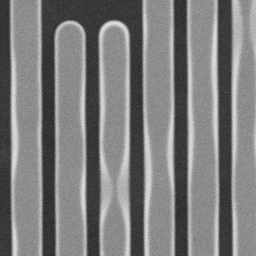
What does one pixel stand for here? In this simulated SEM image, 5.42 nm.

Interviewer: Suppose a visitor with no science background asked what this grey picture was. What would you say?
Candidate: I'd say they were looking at groups of lines, slits or small figures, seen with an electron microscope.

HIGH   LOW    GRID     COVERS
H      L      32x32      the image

LHHHHLLLLLLLLLLLLLHHHHLHHHHLLHHH
LHHHHLLLLLLLLLLLLLHHHHLHHHHLLHHH
LHHHHLLLLLLLLLLLLLHHHHLHHHHLLHHH
LHHHHLLHHHLLLHHHLLHHHHLHHHHLLHHH
LHHHHLLHHHHLLHHHLLHHHHLHHHHLLLHH
LHHHHLLHHHHLLHHHLLHHHHLHHHHLLHHH
LHHHHLLHHHHLLHHHLLHHHHLLHHHLLHHH
LLHHHLLHHHHLLHHHLLHHHHLLHHHLLHHH
LLHHHLLHHHHLLHHHLLHHHHLLHHHLLHHH
LLHHHLLHHHHLLHHHLLHHHHLLHHHLLHHH
LLHHHLLHHHHLLHHHLLHHHHLLHHHLLHHH
LLHHHLLHHHHLLHHHLLHHHHLLHHHLLHHH
LLHHHLLHHHHLLHHHLLHHHHLLHHHLLHHH
LLHHHLLHHHLLLHHHLLHHHHLLHHHLLHHH
LLHHHLLHHHLLLHHHLLHHHHLLHHHLLHHH
LLHHHLLHHHHLLHHHLLHHHHLLHHHLLHHH
LLHHHLLHHHHLLHHHLLHHHLLLHHHLLHHH
LLHHHLLHHHHLLHHHLLHHHLLLHHHLLHHH
LLHHHLLHHHHLLHHHLLHHHLLLHHHLLHHH
LLHHHLLHHHHLLHHHLLHHHLLLHHHLLHHH
LLHHHLLHHHHLLHHHLLHHHLLLHHHLLHHH
LLHHHLLHHHHLLHHHLLHHHLLLHHHLLHHH
LLHHHLLHHHHLLHHHLLHHHHLLHHHLLHHH
LLHHHLLHHHHLLHHHLLHHHHLLHHHLLHHH
LLHHHLLHHHHLLHHHLLHHHHLLHHHLLHHH
LLHHHLLHHHHLLHHHLLHHHHLLHHHLLHHH
LLHHHLLHHHHLLHHHLLHHHHLLHHHLLHHH
LLHHHLLHHHHLLHHHLLHHHHLLHHHLLHHH
LLHHHLLHHHHLLHHHLLHHHHLLHHHLLHHH
LLHHHLLHHHHLLHHHLLHHHHLLHHHLLHHH
LLHHHLLHHHHLLHHHLLHHHHLLHHHLLHHH
LLHHHLLHHHHLLHHHLLHHHHLLHHHLLHHH